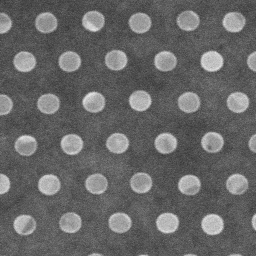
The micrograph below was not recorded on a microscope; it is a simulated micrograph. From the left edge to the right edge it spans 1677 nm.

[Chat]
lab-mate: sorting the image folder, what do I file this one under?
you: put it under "a regular array of raised bodies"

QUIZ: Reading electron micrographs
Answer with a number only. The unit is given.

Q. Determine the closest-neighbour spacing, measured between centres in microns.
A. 0.296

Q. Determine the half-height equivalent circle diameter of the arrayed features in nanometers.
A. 133